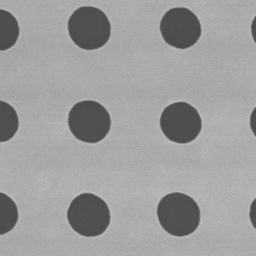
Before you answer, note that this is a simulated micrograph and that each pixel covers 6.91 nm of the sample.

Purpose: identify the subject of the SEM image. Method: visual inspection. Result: holes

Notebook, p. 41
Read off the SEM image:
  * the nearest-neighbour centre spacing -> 630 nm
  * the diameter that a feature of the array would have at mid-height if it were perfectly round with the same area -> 296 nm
